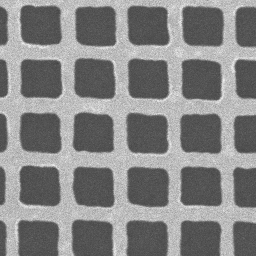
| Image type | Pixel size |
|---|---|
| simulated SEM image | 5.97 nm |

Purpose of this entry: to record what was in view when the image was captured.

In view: a regular array of holes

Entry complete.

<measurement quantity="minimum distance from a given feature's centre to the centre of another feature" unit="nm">316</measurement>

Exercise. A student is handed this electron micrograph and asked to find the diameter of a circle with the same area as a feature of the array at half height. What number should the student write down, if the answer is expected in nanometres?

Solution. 262